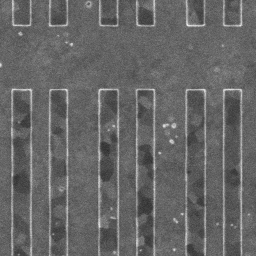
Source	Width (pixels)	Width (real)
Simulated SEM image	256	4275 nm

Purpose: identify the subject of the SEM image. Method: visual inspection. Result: wiring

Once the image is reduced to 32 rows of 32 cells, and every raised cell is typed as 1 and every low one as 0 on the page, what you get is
00110011000011100110000111001100
00110011000011100110000111001100
00110011000011100110000111001100
00000000000000000000000000000000
00000000000000000000000000000000
00000000000000000000000000000000
00000000000000000000000000000000
00000000000000000000000000000000
00000000000000000000000000000000
00000000000000000000000000000000
00000000000000000000000000000000
00110011000011100110000111001100
00110011000011100110000111001100
00110011000011100110000111001100
00110011000011100110000111001100
00110011000011100110000111001100
00110011000011100110000111001100
00110011000011100110000111001100
00110011000011100110000111001100
00110011000011100110000111001100
00110011000011100110000111001100
00110011000011100110000111001100
00110011000011100110000111001100
00110011000011100110000111001100
00110011000011100110000111001100
00110011000011100110000111001100
00110011000011100110000111001100
00110011000011100110000111001100
00110011000011100110000111001100
00110011000011100110000111001100
00110011000011100110000111001100
00110011000011100110000111001100